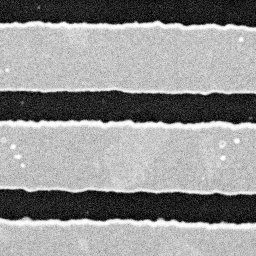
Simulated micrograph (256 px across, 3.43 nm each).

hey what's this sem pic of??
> lines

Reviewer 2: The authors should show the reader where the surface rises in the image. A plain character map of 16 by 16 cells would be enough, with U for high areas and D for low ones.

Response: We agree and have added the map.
DDDDDDDDDDDDDDDD
UUUUUUUDUUUDDDDD
UUUUUUUUUUUUUUUU
UUUUUUUUUUUUUUUU
UUUUUUUUUUUUUUUU
UUUUUUUUUUUUUUUU
DDDDDDDDDDDDDDDD
DDDDDDDDDDDDDDDD
UUUUUUUUUUUUUUUU
UUUUUUUUUUUUUUUU
UUUUUUUUUUUUUUUU
UUUUUUUUUUUUUUUU
DDDDDDDDDDDDDDDD
DDDDDDDDDDDDDDDD
UUUUUUUUUUUUUUUU
UUUUUUUUUUUUUUUU